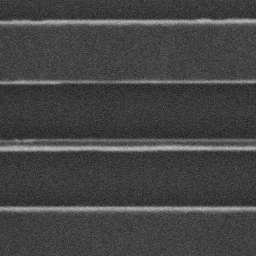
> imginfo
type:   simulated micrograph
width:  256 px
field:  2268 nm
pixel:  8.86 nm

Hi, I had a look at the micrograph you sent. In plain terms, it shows lines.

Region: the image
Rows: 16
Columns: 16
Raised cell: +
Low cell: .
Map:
................
++++++++++++++++
++++++++++++++++
++++++++++++++++
++++++++++++++++
................
................
................
................
................
................
................
................
++++++++++++++++
++++++++++++++++
++++++++++++++++